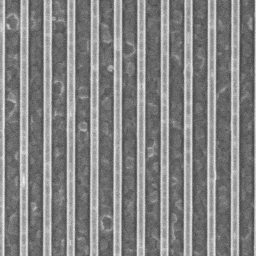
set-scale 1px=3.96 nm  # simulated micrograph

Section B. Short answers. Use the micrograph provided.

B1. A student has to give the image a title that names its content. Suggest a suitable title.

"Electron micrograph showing parallel lines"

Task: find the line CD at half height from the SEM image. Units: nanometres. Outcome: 27.7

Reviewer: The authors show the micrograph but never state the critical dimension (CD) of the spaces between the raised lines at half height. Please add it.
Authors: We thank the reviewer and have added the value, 63.3 nm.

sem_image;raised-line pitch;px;23.5